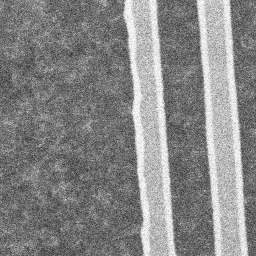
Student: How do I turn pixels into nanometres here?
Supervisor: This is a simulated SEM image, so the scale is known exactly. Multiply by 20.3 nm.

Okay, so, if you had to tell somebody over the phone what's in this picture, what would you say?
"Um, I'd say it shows one or a few lines or trenches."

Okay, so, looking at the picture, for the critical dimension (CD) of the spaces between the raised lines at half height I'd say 47.7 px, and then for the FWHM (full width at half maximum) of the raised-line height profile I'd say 24.8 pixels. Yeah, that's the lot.